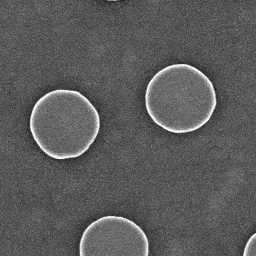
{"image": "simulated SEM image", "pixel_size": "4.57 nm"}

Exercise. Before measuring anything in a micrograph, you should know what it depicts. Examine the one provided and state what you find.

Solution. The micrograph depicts raised bodies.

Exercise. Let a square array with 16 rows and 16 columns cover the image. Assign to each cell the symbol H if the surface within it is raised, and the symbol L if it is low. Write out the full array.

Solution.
LLLLLLLLLLLLLLLL
LLLLLLLLLLLLLLLL
LLLLLLLLLLLLLLLL
LLLLLLLLLLLLLLLL
LLLLLLLLLLHHLLLL
LLLLLLLLLHHHHLLL
LLHHHHLLLHHHHLLL
LLHHHHLLLLHHHLLL
LLHHHHLLLLLLLLLL
LLLHHLLLLLLLLLLL
LLLLLLLLLLLLLLLL
LLLLLLLLLLLLLLLL
LLLLLLLLLLLLLLLL
LLLLLLLLLLLLLLLL
LLLLLHHHHLLLLLLL
LLLLLHHHHLLLLLLH